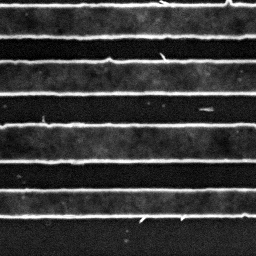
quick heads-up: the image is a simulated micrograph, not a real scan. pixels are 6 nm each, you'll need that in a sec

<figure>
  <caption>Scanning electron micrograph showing one or a few lines or trenches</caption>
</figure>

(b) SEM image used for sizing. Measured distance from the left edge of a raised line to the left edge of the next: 364 nm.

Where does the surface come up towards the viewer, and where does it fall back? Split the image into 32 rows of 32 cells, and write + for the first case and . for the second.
....................+.......+...
++++++++++++++++++++++++++++++++
++++++++++++++++++++++++++++++++
++++++++++++++++++++++++++++++++
++++++++++++++++++++++++++++++++
................................
................................
.............+......+...........
++++++++++++++++++++++++++++++++
++++++++++++++++++++++++++++++++
++++++++++++++++++++++++++++++++
++++++++++++++++++++++++++++++++
................................
................................
................................
.........+......................
++++++++++++++++++++++++++++++++
++++++++++++++++++++++++++++++++
++++++++++++++++++++++++++++++++
++++++++++++++++++++++++++++++++
................................
................................
................................
................................
++++++++++++++++++++++++++++++++
++++++++++++++++++++++++++++++++
++++++++++++++++++++++++++++++++
................................
................................
................................
................................
................................